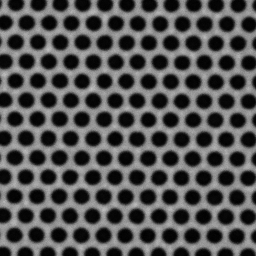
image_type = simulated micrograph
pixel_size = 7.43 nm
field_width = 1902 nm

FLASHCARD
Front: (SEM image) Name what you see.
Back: a regular array of holes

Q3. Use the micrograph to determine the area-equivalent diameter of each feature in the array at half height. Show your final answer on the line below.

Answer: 119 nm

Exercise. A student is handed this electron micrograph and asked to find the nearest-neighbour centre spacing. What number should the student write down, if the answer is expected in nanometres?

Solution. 163